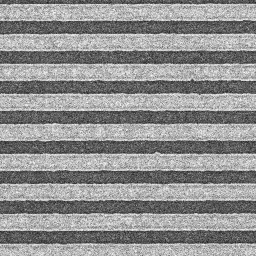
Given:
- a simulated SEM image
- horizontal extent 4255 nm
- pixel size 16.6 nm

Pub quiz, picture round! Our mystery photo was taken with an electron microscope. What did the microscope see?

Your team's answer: parallel lines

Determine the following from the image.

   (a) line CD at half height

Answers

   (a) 256 nanometres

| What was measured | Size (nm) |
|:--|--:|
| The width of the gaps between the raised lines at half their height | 239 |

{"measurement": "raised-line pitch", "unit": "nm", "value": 498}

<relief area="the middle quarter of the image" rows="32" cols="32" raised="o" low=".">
oooooooooooooooooooooooooooooooo
oooooooooooooooooooooooooooooooo
oooooooooooooooooooooooooooooooo
oooooooooooooooooooooooooooooooo
................................
................................
................................
................................
oooooooooooooooooooooooooooooooo
oooooooooooooooooooooooooooooooo
oooooooooooooooooooooooooooooooo
................................
................................
................................
................................
oooooooooooooooooooooooooooooooo
oooooooooooooooooooooooooooooooo
oooooooooooooooooooooooooooooooo
oooooooooooooooooooooooooooooooo
................................
................................
................................
......................oo........
oooooooooooooooooooooooooooooooo
oooooooooooooooooooooooooooooooo
oooooooooooooooooooooooooooooooo
.oo.ooo....oo.......oo.......oo.
................................
................................
................................
oooooooooooooooooooooooooooooooo
oooooooooooooooooooooooooooooooo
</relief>